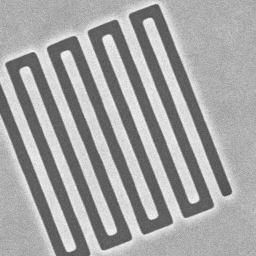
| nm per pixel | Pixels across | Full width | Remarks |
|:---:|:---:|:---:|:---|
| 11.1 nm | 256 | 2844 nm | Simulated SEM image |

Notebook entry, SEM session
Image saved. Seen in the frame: groups of lines, slits or small figures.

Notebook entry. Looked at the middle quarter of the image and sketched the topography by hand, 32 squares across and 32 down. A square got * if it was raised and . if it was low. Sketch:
***...***...***...***...***...**
.**....**...***....**...***...**
.***...***...***...***...**....*
.***...***...***...***...***...*
..***...***...**....**....**...*
..***...***...***...***...***...
...**...***...***...***...***...
...***...***...***...**....***..
....**...***...***...***...***..
*...***...**....**....**...***..
*...***...***...***...***...***.
*...****...**...***...***...***.
**...***...***...**....***...**.
**...***...***...***...***...***
***...**....**....**...***....**
***...***...***...***...***...**
.**....**...***...***...***...**
.***...***...***...***...**....*
.***...***...***...***...***...*
..***...***...**....**....**...*
..***...***...***...***...***...
...**...***...***...***...***...
...***...***...***...**....**...
...***...***...***...***...***..
....***...**....**....**...***..
*...***...***...***...***...***.
*...***....**...***...***...***.
**...***...***...**....**....**.
**...***...***...***...***...***
***...**....**....**...***....**
***...***...***...***...***...**
.**....**...***...***...***...**